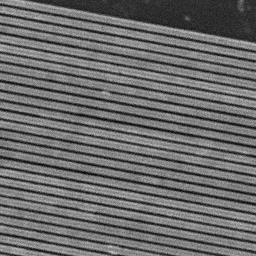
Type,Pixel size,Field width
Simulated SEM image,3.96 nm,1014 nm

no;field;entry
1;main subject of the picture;parallel lines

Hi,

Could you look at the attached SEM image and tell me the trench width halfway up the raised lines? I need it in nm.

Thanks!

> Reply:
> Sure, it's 15.1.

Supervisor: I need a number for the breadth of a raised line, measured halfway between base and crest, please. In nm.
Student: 22.5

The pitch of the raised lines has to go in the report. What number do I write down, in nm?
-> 37.2